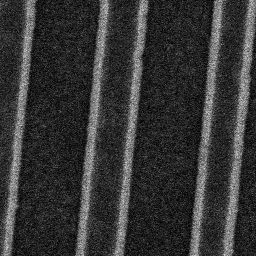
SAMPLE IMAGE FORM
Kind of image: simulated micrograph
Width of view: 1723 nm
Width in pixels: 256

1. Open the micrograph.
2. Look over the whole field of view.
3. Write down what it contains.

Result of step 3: one or a few lines or trenches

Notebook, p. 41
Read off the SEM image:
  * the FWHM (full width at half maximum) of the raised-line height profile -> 0.255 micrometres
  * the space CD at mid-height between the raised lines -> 72.3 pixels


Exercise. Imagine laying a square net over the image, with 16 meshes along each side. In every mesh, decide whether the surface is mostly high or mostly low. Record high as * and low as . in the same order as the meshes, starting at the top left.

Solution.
**....***.....**
**....***.....**
**....***....***
**....***....**.
**....***....**.
**....***....**.
*.....**.....**.
*.....**.....**.
*.....**.....**.
*.....**.....**.
*.....**.....**.
*....***.....**.
*....***....***.
*....***....**..
*....***....**..
.....***....**..